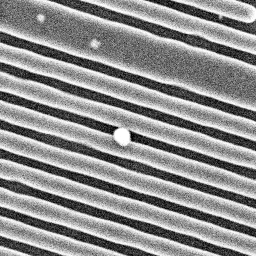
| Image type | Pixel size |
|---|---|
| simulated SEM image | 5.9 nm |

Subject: groups of lines, slits or small figures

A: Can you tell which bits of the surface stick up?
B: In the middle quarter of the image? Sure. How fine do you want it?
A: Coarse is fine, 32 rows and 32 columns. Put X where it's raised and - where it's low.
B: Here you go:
XXX---------XXXXXXXXXXXXXXXXXXXX
XXXXXX---------XXXXXXXXXXXXXXXXX
XXXXXXXXX---------XXXXXXXXXXXXXX
XXXXXXXXXXXXX---------XXXXXXXXXX
-XXXXXXXXXXXXXXX---------XXXXXXX
----XXXXXXXXXXXXXXX-----------XX
--------XXXXXXXXXXXXXX----------
X----------XXXXXXXXXXXXXX-------
XXXX----------XXXXXXXXXXXXXX----
XXXXXXXX---------XXXXXXXXXXXXXXX
XXXXXXXXXXXX---------XXXXXXXXXXX
-XXXXXXXXXXXXXX---------XXXXXXXX
----XXXXXXXXXXXXXX---------XXXXX
--------XXXXXXXXXXXXX---------XX
XX--------XXXXXXXXXXXXXX--------
XXXXX--------XXXXXXXXXXXXXX-----
XXXXXXXX-----XXXXXXXXXXXXXXXXXX-
XXXXXXXXXXX-XXXX---XXXXXXXXXXXXX
XXXXXXXXXXXXXXXX-------XXXXXXXXX
----XXXXXXXXXXXXX---------XXXXXX
-------XXXXXXXXXXXXXX--------XXX
---------XXXXXXXXXXXXXXX--------
XXXX--------XXXXXXXXXXXXXXX-----
XXXXXXX---------XXXXXXXXXXXXXX--
XXXXXXXXXXX---------XXXXXXXXXXXX
XXXXXXXXXXXXX---------XXXXXXXXXX
--XXXXXXXXXXXXXX---------XXXXXXX
-----XXXXXXXXXXXXXX---------XXXX
--------XXXXXXXXXXXXXXX--------X
XXX--------XXXXXXXXXXXXXXX------
XXXXXX---------XXXXXXXXXXXXXXX--
XXXXXXXXX--------XXXXXXXXXXXXXXX